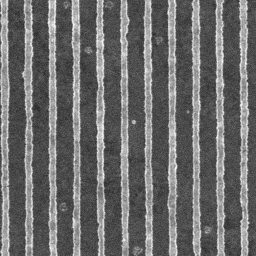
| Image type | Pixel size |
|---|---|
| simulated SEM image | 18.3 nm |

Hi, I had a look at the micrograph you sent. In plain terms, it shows parallel lines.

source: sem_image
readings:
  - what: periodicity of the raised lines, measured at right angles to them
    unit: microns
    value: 0.438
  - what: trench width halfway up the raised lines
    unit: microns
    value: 0.337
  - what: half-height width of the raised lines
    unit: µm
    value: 0.105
